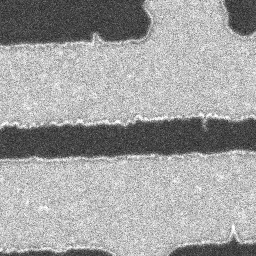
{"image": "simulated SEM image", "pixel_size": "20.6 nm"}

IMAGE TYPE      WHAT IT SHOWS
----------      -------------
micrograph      one or a few lines or trenches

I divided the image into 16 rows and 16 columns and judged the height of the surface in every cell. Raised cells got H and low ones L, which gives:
HHHHHHHHHLLLLLHH
HHHHHHHHHHLLLLHH
HHHHHHHHHLLLLLLL
LLLLLLLLLLLLLLLL
LLLLLLLLLLLLLLLL
LLLLLLLLLLLLLLLL
LLLLLLLLLLLLLLLL
LLLLLLLLHHHHHHHH
HHHHHHHHHHHHHHHH
HHHHHHHHHHHHHHHH
LLLLLLLLLLLLLLLL
LLLLLLLLLLLLLLLL
LLLLLLLLLLLLLLLL
LLLLLLLLLLLLLLLL
LLLLLLLLLLLLLLLL
LLLLHHLLLLLHHHHH